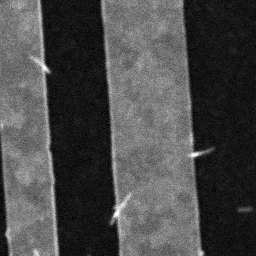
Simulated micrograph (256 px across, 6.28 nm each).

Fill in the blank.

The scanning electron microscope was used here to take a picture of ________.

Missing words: one or a few lines or trenches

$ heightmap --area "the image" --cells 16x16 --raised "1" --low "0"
1100001111100000
1110000111100000
1110000111110000
1110000111110000
1110000111110000
1110000111110000
1110000111110000
1110000111110000
1110000111110000
1110000111110000
1110000111110000
1110000111110000
1110000111110000
1110000111110000
1110000111110000
0111000011110000